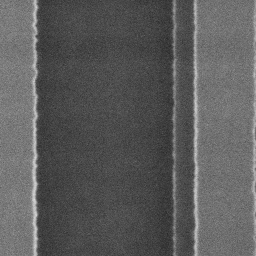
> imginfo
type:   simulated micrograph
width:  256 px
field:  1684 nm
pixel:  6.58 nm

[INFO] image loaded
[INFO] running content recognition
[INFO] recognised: lines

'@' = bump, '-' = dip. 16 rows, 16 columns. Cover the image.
@@----------@@@@
@@----------@@@@
@@----------@@@@
@@----------@@@@
@@----------@@@@
@@----------@@@@
@@----------@@@@
@@----------@@@@
@@----------@@@@
@@----------@@@@
@@----------@@@@
@@----------@@@@
@@----------@@@@
@@----------@@@@
@@----------@@@@
@@----------@@@@